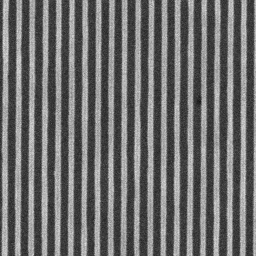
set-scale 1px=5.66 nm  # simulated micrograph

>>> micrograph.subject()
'parallel lines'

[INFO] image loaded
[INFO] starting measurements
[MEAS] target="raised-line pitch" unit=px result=13.2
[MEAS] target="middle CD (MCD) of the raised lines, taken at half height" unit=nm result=29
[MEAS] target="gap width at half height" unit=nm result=48.8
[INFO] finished